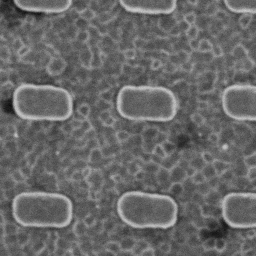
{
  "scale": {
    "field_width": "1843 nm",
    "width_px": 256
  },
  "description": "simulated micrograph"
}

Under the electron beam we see raised bodies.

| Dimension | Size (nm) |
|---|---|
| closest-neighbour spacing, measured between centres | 755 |